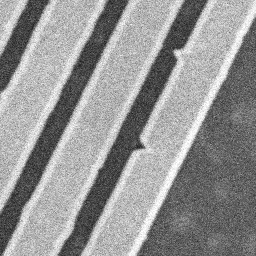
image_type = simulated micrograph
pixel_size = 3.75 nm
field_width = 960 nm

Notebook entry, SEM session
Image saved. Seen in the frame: one or a few lines or trenches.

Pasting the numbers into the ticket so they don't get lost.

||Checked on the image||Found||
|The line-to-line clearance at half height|0.102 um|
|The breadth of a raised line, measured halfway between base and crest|42.1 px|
